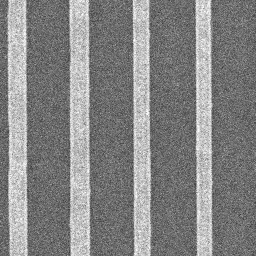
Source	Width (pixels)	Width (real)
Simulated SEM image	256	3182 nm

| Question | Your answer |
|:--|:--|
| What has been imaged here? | one or a few lines or trenches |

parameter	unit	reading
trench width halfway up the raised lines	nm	580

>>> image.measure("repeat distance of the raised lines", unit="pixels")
62.1